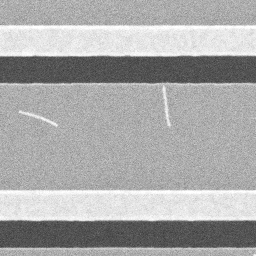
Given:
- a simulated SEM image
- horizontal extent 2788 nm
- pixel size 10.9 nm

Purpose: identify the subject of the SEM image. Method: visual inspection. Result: lines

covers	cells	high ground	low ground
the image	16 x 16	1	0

1111111111111111
1111111111111111
1111111111111111
0000000000000000
0000000000000000
1111111111111111
1111111111111111
1111111111111111
1111111111111111
1111111111111111
1111111111111111
1111111111111111
1111111111111111
1111111111111111
0000000000000000
0000000000000000